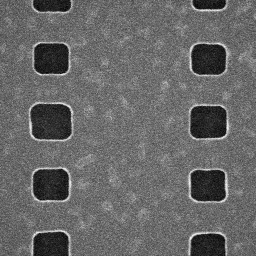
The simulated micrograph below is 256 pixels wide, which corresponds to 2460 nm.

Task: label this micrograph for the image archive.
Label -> holes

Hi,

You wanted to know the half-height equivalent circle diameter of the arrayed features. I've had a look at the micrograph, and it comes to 359 nanometers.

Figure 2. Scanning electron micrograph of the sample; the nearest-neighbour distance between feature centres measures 604 nanometres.